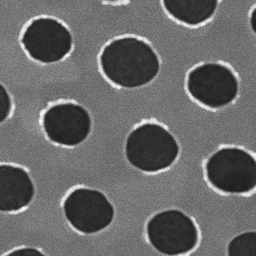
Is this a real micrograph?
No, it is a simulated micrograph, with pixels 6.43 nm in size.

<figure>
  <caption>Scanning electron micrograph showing holes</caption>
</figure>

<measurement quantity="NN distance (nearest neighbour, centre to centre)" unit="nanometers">555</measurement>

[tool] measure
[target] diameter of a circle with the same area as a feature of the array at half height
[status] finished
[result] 294 nanometres